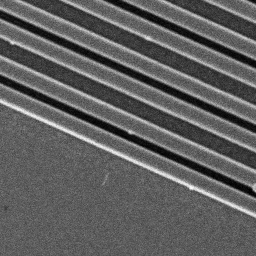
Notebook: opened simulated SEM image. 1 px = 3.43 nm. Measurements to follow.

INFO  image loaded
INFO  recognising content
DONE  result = parallel lines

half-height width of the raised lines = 58 nm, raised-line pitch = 98.5 nm